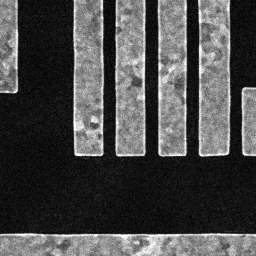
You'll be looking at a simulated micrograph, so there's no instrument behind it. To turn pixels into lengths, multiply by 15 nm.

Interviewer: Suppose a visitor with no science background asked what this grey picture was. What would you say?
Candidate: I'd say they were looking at wiring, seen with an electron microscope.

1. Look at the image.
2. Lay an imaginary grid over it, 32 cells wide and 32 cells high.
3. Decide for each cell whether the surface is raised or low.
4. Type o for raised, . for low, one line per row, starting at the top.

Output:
oo.......oooo..ooo..ooo..oooo...
oo.......oooo..ooo..ooo..oooo...
oo.......oooo..ooo..ooo..oooo...
oo.......oooo..ooo..ooo..oooo...
oo.......oooo..ooo..ooo..oooo...
oo.......oooo..ooo..ooo..oooo...
oo.......oooo..ooo..ooo..oooo...
oo.......oooo..ooo..ooo..oooo...
oo.......oooo..ooo..ooo..oooo...
oo.......oooo..ooo..ooo..oooo...
oo.......oooo..ooo..ooo..oooo...
.o.......oooo..ooo..ooo..oooo.oo
.........oooo..ooo..ooo..oooo.oo
.........oooo..ooo..ooo..oooo.oo
.........oooo..ooo..ooo..oooo.oo
.........oooo..ooo..ooo..oooo.oo
.........oooo..ooo..ooo..oooo.oo
.........oooo..ooo..ooo..oooo.oo
.........oooo..ooo..ooo..oooo.oo
................................
................................
................................
................................
................................
................................
................................
................................
................................
................................
oooooooooooooooooooooooooooooooo
oooooooooooooooooooooooooooooooo
oooooooooooooooooooooooooooooooo